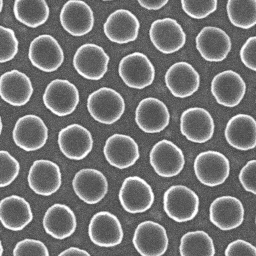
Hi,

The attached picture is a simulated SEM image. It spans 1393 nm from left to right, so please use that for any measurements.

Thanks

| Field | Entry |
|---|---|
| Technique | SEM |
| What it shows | a regular array of raised bodies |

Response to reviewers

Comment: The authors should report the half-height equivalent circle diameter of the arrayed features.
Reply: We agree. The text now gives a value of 185 nanometers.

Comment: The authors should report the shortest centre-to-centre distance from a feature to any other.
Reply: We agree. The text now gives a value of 250 nm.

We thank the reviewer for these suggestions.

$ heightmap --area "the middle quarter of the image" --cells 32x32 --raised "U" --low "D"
DDDUUUUUUUUDDDUUUUUUUUDDDDDUUUUU
DDDUUUUUUUUDDDUUUUUUUUDDDDUUUUUU
DDDDUUUUUUDDDDUUUUUUUUDDDDUUUUUU
DDDDDDUUUDDDDDDUUUUUUUDDDUUUUUUU
UDDDDDDDDDDDDDDUUUUUUUDDDDUUUUUU
UUUDDDDDDDDDDDDDUUUUUDDDDDUUUUUU
UUUDDDDDDUUUDDDDDDDDDDDDDDDUUUUU
UUUDDDDUUUUUUUDDDDDDDDDDDDDUUUUU
UUUUDDUUUUUUUUDDDDDDDDDDDDDDDDDD
UUUDDDUUUUUUUUUDDDDUUUUUDDDDDDDD
UUUDDDUUUUUUUUUDDDDUUUUUUDDDDDDD
UUDDDDUUUUUUUUUDDDUUUUUUUUDDDDDU
UDDDDDDUUUUUUUDDDDUUUUUUUUDDDDUU
DDDDDDDDUUUUUUDDDDUUUUUUUUDDDUUU
DDDDDDDDDUUUDDDDDDUUUUUUUUDDDUUU
DUUUDDDDDDDDDDDDDDDUUUUUUDDDDUUU
UUUUUUDDDDDDDDDDDDDDUUUUDDDDDUUU
UUUUUUDDDDDDDDDDDDDDDDDDDDDDDDUU
UUUUUUUDDDDUUUUUUDDDDDDDDDDDDDDU
UUUUUUUDDDDUUUUUUUDDDDDDUUDDDDDD
UUUUUUUDDDUUUUUUUUDDDDDUUUUUDDDD
UUUUUUUDDDUUUUUUUUDDDDUUUUUUUDDD
UUUUUUDDDDUUUUUUUUUDDDUUUUUUUUDD
DDUUDDDDDDDUUUUUUUDDDDUUUUUUUUDD
DDDDDDDDDDDUUUUUUUDDDDUUUUUUUUDD
DDDDDDDDDDDDDUUUDDDDDDUUUUUUUUDD
DDDDDUUDDDDDDDDDDDDDDDDUUUUUUDDD
DDDUUUUUUUDDDDDDDDDDDDDDUUUUDDDD
DDDUUUUUUUDDDDDDUUUDDDDDDDDDDDDD
DDUUUUUUUUUDDDDUUUUUDDDDDDDDDDDD
DDUUUUUUUUUDDDDUUUUUUDDDDDDDDDDD
DDDUUUUUUUUDDDUUUUUUUUDDDDUUUUUD